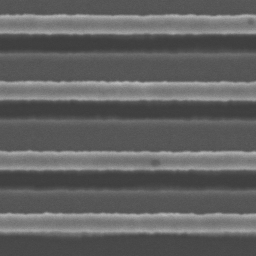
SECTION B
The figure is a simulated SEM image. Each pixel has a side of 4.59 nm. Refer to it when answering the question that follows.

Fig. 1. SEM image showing lines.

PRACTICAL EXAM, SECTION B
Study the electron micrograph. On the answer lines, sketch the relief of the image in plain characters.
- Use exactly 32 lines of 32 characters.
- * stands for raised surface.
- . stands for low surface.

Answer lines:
********************************
********************************
********************************
********************************
................................
................................
................................
********************************
********************************
********************************
********************************
********************************
********************************
................................
................................
********************************
********************************
********************************
********************************
********************************
********************************
................................
................................
................................
********************************
********************************
********************************
********************************
********************************
................................
................................
................................